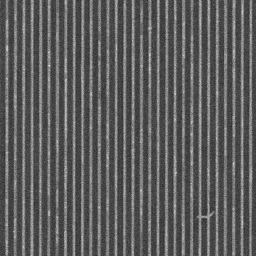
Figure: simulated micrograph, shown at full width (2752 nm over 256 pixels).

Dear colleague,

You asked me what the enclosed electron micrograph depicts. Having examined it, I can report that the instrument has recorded parallel lines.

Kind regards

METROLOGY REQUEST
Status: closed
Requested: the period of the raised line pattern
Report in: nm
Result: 90.3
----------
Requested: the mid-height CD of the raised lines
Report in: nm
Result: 20.2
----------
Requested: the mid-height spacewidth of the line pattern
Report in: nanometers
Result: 68.5